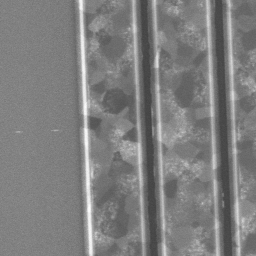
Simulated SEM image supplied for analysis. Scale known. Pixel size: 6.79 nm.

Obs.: one or a few lines or trenches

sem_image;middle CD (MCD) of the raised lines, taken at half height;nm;368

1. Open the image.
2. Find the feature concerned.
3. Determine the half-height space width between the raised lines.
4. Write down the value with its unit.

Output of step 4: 129 nm